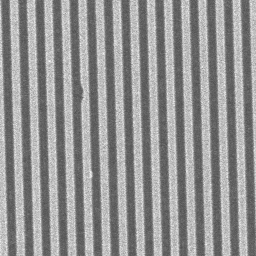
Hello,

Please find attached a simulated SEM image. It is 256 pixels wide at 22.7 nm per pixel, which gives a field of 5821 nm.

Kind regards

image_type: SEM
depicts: parallel lines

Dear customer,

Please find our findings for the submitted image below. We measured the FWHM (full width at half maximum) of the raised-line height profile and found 190 nm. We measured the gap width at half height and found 190 nanometres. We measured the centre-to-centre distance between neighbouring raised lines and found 389 nm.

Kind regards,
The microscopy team